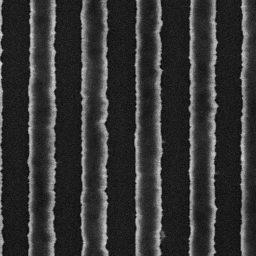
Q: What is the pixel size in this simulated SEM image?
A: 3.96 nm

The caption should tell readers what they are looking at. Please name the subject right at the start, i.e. lines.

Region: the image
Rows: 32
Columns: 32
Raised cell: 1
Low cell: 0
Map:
00001110001110000111000011100011
00001110001110000111000011100011
00001110001110000111000011100011
00001110001110000111000011100011
00001110001110000111000011100001
00001110001110000111000011100011
00001110001110000111000011100011
00001110001110000111000011100011
00001110001110000111000011100011
00001110001110000111000011100011
00001110001110000111000011100011
00001110001110000111000011100011
00001110001110000111000011100011
00001110001110000111000011100011
00001110001110000111000011100011
00001110001110000111000011100011
00001110001110000111000011100011
00001110001110000111000011100011
00001110001110000111000011100011
00001110001110000111000011100011
00001110001110000111000011100011
00001110001110000111000011100011
00001110001110000111000011100011
00001110001110000111000011100011
00001110001110000111000011100011
00001110001110000111000011100011
00001110001110000111000011100011
00001110001110000111000011100011
00001110001110000111000011100011
00001110001110000111000011100011
00001110001110000111000011100011
00001110001110000111000011100011